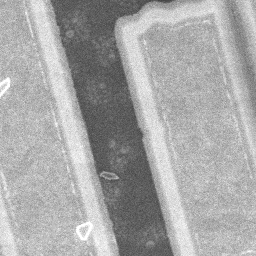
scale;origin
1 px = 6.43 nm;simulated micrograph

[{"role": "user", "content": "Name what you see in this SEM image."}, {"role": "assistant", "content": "one or a few lines or trenches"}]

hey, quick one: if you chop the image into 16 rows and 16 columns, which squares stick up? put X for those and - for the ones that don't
XX-----------X-X
XXX------XXXXX--
XXX-----XXXXXX--
XXX-----XXXXXXX-
XXX------XXXXXX-
XXXX-----XXXXXX-
XXXX-----XXXXXX-
XXXX------XXXXXX
XXXXX-----XXXXXX
XXXXX-----XXXXXX
XXXXX-----XXXXXX
XXXXX------XXXXX
XXXXXX-----XXXXX
XXXXXX-----XXXXX
XXXXXX-----XXXXX
-XXXXX------XXXX